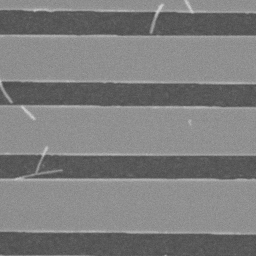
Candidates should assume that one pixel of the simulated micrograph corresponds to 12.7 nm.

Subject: lines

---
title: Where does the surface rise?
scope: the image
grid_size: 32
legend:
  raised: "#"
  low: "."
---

################################
...................#..##########
................................
................................
###############.................
################################
################################
################################
################################
################################
................................
................................
................................
################################
################################
################################
################################
################################
################################
................................
................................
................................
###########################..###
################################
################################
################################
################################
################################
################################
................................
................................
................................